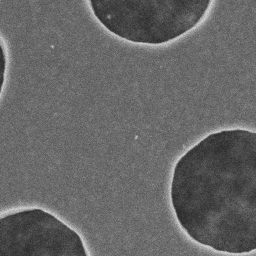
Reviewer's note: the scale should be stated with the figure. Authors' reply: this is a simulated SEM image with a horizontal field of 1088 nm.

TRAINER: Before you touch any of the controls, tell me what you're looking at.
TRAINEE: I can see holes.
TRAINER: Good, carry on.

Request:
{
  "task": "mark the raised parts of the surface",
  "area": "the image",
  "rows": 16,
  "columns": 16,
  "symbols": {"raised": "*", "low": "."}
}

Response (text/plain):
******.......***
******......****
********...*****
****************
****************
****************
****************
****************
*************...
************....
***********.....
***********.....
***********.....
...********.....
.....*******....
.....********...